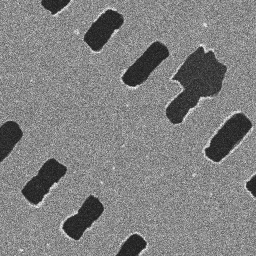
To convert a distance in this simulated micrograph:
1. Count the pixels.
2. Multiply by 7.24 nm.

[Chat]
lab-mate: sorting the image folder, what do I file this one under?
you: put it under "holes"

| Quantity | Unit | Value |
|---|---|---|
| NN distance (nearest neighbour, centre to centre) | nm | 400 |